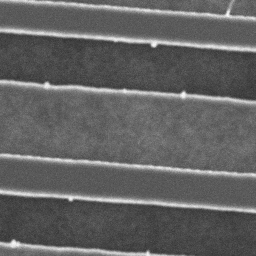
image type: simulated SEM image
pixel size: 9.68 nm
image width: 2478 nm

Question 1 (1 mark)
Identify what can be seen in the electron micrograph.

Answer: lines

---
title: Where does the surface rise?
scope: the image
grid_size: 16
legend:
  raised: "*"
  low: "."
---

****************
****************
.......*********
................
................
*****...........
****************
****************
****************
****************
****************
****************
.......*********
................
................
***.............